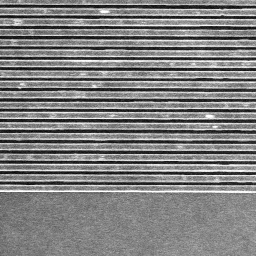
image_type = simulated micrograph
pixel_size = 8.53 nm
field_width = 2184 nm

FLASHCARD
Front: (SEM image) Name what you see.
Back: parallel lines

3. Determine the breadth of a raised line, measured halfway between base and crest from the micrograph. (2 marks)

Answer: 57.6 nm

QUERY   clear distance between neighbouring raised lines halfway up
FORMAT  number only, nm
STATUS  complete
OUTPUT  33.1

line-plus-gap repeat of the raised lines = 88.6 nm